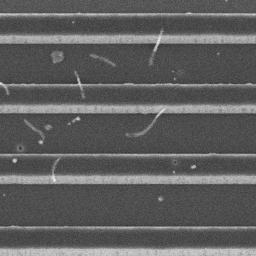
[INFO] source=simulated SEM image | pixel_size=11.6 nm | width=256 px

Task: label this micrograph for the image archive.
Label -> lines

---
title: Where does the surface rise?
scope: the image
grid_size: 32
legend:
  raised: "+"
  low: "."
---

................................
................................
++++++++++++++++++++++++++++++++
++++++++++++++++++++++++++++++++
++++++++++++++++++++++++++++++++
................................
................................
................................
................................
................................
+........+.....++..+++.....+...+
++++++++++++++++++++++++++++++++
++++++++++++++++++++++++++++++++
++++++++++++++++++++++++++++++++
................................
................................
................................
................................
................................
++++++++++++++++++++++++++++++++
++++++++++++++++++++++++++++++++
++++++++++++++++++++++++++++++++
++++++++++++++++++++++++++++++++
................................
................................
................................
................................
................................
++++++++++++++++++++++++++++++++
++++++++++++++++++++++++++++++++
++++++++++++++++++++++++++++++++
++++++++++++++++++++++++++++++++